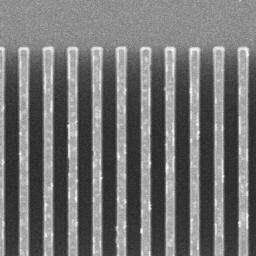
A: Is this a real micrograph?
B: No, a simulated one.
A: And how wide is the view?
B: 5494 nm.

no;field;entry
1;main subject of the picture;parallel lines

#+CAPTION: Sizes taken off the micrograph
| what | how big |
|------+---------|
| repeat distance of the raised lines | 523 nanometres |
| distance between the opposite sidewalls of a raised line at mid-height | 204 nm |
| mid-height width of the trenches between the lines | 0.325 µm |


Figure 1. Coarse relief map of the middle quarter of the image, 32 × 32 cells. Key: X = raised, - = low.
-XX----XX----XX----XX----XXX----
-XX----XX----XX----XX----XXX----
-XX----XX----XX----XXX---XXX----
-XX----XX----XX----XXX---XXX----
-XX----XX----XX----XXX---XXX----
-XX----XX----XX----XXX---XXX----
-XX----XX----XX----XXX---XXX----
-XX----XX----XX----XXX---XXX----
-XX----XX----XX----XXX---XXX----
-XX----XX----XX----XXX---XXX----
-XX----XX----XX----XXX---XXX----
-XX----XX----XX----XXX---XXX----
-XX----XX----XX----XXX---XXX----
-XX----XX----XX----XXX---XXX----
-XX----XX----XX----XXX---XXX----
-XX----XX----XX----XXX---XXX----
-XX----XX----XX----XXX---XXX----
-XX----XX----XX----XXX---XXX----
-XX----XX----XX----XXX---XXX----
-XX----XX----XX----XXX---XXX----
-XX----XX----XX----XXX---XXX----
-XX----XX----XX----XXX---XXX----
-XX----XX----XX----XXX---XXX----
-XX----XX----XX----XXX---XXX----
-XX----XX----XX----XXX---XXX----
-XX----XX----XX----XXX---XXX----
-XX----XX----XX----XXX---XXX----
-XX----XX----XX----XXX---XXX----
-XX----XXX---XX----XXX---XXX----
-XX----XX----XX----XXX---XXX----
-XX----XX----XX----XXX---XXX----
-XX----XX----XX----XXX---XXX----